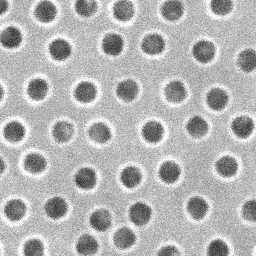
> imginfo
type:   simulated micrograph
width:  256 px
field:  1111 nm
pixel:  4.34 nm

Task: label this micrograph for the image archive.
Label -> a regular array of holes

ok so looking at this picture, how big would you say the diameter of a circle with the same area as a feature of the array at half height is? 110 nm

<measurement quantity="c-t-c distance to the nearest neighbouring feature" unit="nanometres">176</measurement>